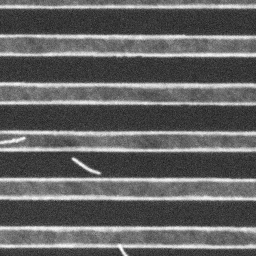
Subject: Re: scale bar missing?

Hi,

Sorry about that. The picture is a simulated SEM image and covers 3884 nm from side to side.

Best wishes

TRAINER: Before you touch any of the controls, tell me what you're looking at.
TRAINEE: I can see lines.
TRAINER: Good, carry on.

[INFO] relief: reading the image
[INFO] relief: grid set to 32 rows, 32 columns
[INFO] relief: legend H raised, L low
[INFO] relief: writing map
HHHHHHHHHHHHHHHHHHHHHHHHHHHHHHHH
LLLLLLLLLLLLLLLLLLLLLLLLLLLLLLLL
LLLLLLLLLLLLLLLLLLLLLLLLLLLLLLLL
LLLLLLLLLLLLLLLLLLLLLLLLLLLLLLLL
LLLLLLLLLLLLLLLLLLLLLLLLLLLLLLLL
HHHHHHHHHHHHHHHHHHHHHHHHHHHHHHHH
HHHHHHHHHHHHHHHHHHHHHHHHHHHHHHHH
LLLLLLLLLLLLLLLLLLLLLLLLLLLLLLLL
LLLLLLLLLLLLLLLLLLLLLLLLLLLLLLLL
LLLLLLLLLLLLLLLLLLLLLLLLLLLLLLLL
HHHLLLLLLLLLLLLLLLLLLLLLLLLLLLLL
HHHHHHHHHHHHHHHHHHHHHHHHHHHHHHHH
HHHHHHHHHHHHHHHHHHHHHHHHHHHHHHHH
LLLLLLLLLLLLLLLLLLLLLLLLLLLLLLLL
LLLLLLLLLLLLLLLLLLLLLLLLLLLLLLLL
LLLLLLLLLLLLLLLLLLLLLLLLLLLLLLLL
LLLLLLLLLLLLLLLLLLLLLLLLLLLLLLLL
HHHHHHHHHHHHHHHHHHHHHHHHHHHHHHHH
HHHHHHHHHHHHHHHHHHHHHHHHHHHHHHHH
LLLLLLLLLLLLLLLLLLLLLLLLLLLLLLLL
LLLLLLLLLLLLLLLLLLLLLLLLLLLLLLLL
LLLLLLLLLLLLLLLLLLLLLLLLLLLLLLLL
HHHHHHHHHHHHHHHHHHHHHHHHHHHHHHHL
HHHHHHHHHHHHHHHHHHHHHHHHHHHHHHHH
HHHHHHHHHHHHHHHHHHHHHHHHHHHHHHHH
LLLLLLLLLLLLLLLLLLLLLLLLLLLLLLLL
LLLLLLLLLLLLLLLLLLLLLLLLLLLLLLLL
LLLLLLLLLLLLLLLLLLLLLLLLLLLLLLLL
LLLLLLLLLLLLLLLLLLLLLLLLLLLLLLLL
HHHHHHHHHHHHHHHHHHHHHHHHHHHHHHHH
HHHHHHHHHHHHHHHHHHHHHHHHHHHHHHHH
LLLLLLLLLLLLLLLLLLLLLLLLLLLLLLLL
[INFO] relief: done